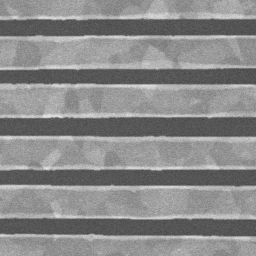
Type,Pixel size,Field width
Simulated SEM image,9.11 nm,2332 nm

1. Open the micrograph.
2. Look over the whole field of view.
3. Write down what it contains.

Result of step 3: lines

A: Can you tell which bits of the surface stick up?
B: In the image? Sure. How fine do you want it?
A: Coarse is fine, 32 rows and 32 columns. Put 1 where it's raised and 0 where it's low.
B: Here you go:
11111111111111111111111111111111
11111111111111111111111111111111
00000000000000000000000000000000
00000000000000000000000000000000
00000000000000000000000000000000
11111111111111111111111111111111
11111111111111111111111111111111
11111111111111111111111111111111
11111000000000000000000000000000
00000000000000000000000000000000
00000000000000000000000000000000
11111111111111111111111111111111
11111111111111111111111111111111
11111111111111111111111111111111
10111100000000000000000000000000
00000000000000000000000000000000
00000000000000000000000000000000
11111111111111111111111111111111
11111111111111111111111111111111
11111111111111111111111111111111
11111111111111111111111111111111
00000000000000000000000000000000
00000000000000000000000000000000
11111111000000000011111100000000
11111111111111111111111111111111
11111111111111111111111111111111
11111111111111111111111111111111
00000000000000000000000000000000
00000000000000000000000000000000
00000000000100000000000000000000
11111111111111111111111111111111
11111111111111111111111111111111